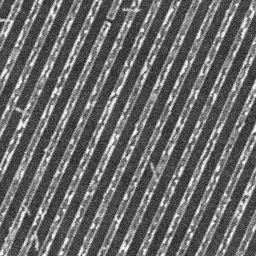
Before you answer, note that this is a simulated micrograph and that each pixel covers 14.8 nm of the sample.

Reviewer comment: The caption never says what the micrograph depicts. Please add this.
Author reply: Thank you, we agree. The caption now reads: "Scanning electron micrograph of parallel lines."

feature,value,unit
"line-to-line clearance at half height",167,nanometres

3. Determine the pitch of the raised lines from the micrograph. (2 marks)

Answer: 266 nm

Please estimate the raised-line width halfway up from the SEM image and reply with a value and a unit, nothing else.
103 nanometers